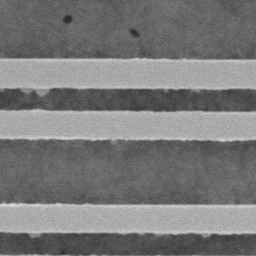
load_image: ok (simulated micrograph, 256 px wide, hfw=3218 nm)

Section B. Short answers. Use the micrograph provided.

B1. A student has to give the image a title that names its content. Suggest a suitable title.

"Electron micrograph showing lines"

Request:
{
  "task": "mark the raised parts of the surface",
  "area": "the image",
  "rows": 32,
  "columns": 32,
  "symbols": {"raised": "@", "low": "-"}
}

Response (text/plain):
--------------------------------
--------------------------------
--------------------------------
--------------------------------
--------------------------------
--------------------------------
--------------------------------
@@@@@@@@@@@@@@@-@@@-@-@---------
@@@@@@@@@@@@@@@@@@@@@@@@@@@@@@@@
@@@@@@@@@@@@@@@@@@@@@@@@@@@@@@@@
@@@@@@@@@@@@@@@@@@@@@@@@@@@@@@@@
--------------------------------
--------------------------------
--------------------------------
@@@@@@@@@@@@@@@@@@@@@@@@@@@@@@@@
@@@@@@@@@@@@@@@@@@@@@@@@@@@@@@@@
@@@@@@@@@@@@@@@@@@@@@@@@@@@@@@@@
-------------------------@@@@@@-
--------------------------------
--------------------------------
--------------------------------
--------------------------------
--------------------------------
--------------------------------
--------------------------------
--------------------------------
@@@@@@@@@@@@@@@@@@@@@@@@@@@@@@@@
@@@@@@@@@@@@@@@@@@@@@@@@@@@@@@@@
@@@@@@@@@@@@@@@@@@@@@@@@@@@@@@@@
--------------------------------
--------------------------------
--------------------------------